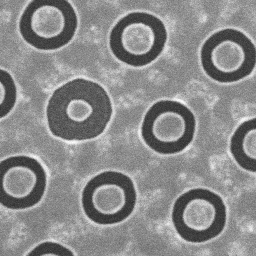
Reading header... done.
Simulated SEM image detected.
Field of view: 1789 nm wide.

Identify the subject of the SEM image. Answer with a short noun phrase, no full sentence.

ring-shaped grooves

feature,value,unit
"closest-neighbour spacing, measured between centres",639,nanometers